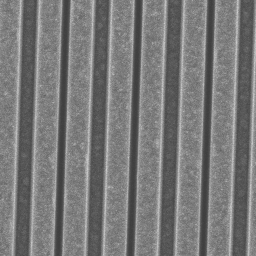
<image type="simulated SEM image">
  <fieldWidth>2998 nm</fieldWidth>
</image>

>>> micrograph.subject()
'parallel lines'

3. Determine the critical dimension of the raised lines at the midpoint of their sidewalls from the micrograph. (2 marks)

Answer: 282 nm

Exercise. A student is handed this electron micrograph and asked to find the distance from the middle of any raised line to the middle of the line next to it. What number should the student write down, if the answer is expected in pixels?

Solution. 35.2